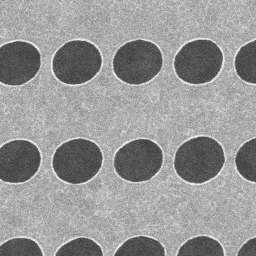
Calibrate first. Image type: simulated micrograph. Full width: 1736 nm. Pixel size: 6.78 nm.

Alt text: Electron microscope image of holes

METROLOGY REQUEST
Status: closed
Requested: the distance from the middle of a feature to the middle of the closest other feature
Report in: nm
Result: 414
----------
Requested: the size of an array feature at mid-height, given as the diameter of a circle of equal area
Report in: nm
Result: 326